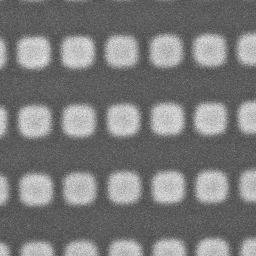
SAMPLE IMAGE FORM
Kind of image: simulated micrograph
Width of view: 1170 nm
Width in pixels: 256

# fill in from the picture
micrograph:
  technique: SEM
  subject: a regular array of raised bodies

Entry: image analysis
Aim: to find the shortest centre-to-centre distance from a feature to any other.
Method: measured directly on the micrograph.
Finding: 200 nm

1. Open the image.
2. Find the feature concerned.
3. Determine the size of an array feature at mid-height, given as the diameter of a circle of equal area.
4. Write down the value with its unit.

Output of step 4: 0.146 um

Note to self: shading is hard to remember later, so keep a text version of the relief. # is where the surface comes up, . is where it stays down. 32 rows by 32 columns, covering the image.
................................
................................
................................
................................
...............................#
..####..###..####..####.####..##
#.####..####.####..####.####..##
#.####..###..####..####..###..##
................................
................................
................................
................................
................................
...###...##...###..###...###..##
#..###..####..###..####.####..##
#..###..####..###..####.####..##
...###..###...###..###...###....
................................
................................
................................
................................
...............................#
#..###..####..###..####..###..##
#..###..####..###..####..###..##
#..###..####..###..####..###..##
................................
................................
................................
................................
................................
....##...##...###...###..###..##
#..###..####..####.####..###..##